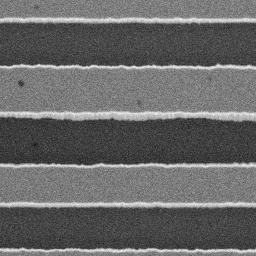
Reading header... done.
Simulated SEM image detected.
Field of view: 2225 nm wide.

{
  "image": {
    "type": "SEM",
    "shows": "lines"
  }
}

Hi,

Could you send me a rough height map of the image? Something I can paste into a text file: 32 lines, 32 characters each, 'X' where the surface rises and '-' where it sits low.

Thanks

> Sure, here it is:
XXXXXXXXXXXXXXXXXXXXXXXXXXXXXXXX
XXXXXXXXXXXXXXXXXXXXXXXXXXXXXXXX
-----------XXXX---X-XXXXXXXXXX--
--------------------------------
--------------------------------
--------------------------------
--------------------------------
--------------------------------
XXXXXXXXXXXXXXXXXXXXXXXXXXXXXXXX
XXXXXXXXXXXXXXXXXXXXXXXXXXXXXXXX
XXXXXXXXXXXXXXXXXXXXXXXXXXXXXXXX
XXXXXXXXXXXXXXXXXXXXXXXXXXXXXXXX
XXXXXXXXXXXXXXXXXXXXXXXXXXXXXXXX
XXXXXXXXXXXXXXXXXXXXXXXXXXXXXXXX
--------------------------------
--------------------------------
--------------------------------
--------------------------------
--------------------------------
--------------------------------
--------------------------------
XXXXXXXXXXXXXXXXXXXXXXXXXXXXXXXX
XXXXXXXXXXXXXXXXXXXXXXXXXXXXXXXX
XXXXXXXXXXXXXXXXXXXXXXXXXXXXXXXX
XXXXXXXXXXXXXXXXXXXXXXXXXXXXXXXX
XXXXXXXXXXXXXXXXXXXXXXXXXXXXXXXX
--------------------------------
--------------------------------
--------------------------------
--------------------------------
--------------------------------
XXXXXXXXXXXXXXXXXXXXXXXXXXXXXXXX